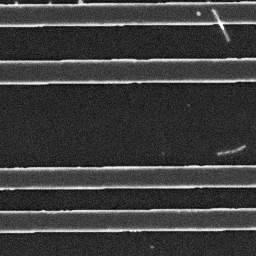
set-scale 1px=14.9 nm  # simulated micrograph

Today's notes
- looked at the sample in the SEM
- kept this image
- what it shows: lines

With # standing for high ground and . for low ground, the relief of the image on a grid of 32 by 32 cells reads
...........#####################
################################
################################
................................
................................
................................
................................
...................#############
################################
################################
................................
................................
................................
................................
................................
................................
................................
................................
................................
................................
................................
################################
################################
#############...................
................................
................................
################################
################################
################################
................................
................................
................................